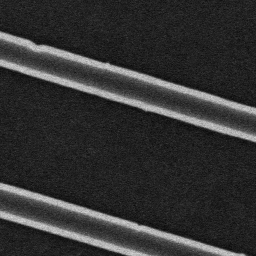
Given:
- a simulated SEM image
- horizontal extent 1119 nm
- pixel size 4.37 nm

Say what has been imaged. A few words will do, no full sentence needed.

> one or a few lines or trenches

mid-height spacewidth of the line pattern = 505 nanometers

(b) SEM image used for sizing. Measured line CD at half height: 126 nm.